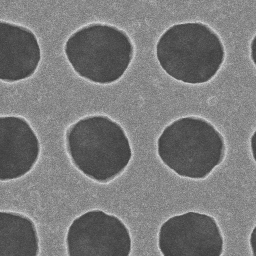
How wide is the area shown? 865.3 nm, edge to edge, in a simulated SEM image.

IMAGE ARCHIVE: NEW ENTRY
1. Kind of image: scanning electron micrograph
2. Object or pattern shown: holes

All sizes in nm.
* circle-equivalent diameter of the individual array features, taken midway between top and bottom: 212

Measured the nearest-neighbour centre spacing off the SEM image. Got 310 nm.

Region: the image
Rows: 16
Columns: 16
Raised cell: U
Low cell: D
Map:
UUUUUUUUUUUUUUUU
DUUUUUUUUUUUDUUU
DDUUDDDDUUDDDDUU
DDUUDDDDUUDDDDUU
DDUUUDDDUUDDDUUU
UUUUUUUUUUUUUUUU
UUUUUUUUUUUUUUUU
DUUUUDDUUUUDDUUU
DDUUDDDDUUDDDDUU
DDUUDDDDUUDDDDUU
DDUUUDDDUUUDDUUU
UUUUUUUUUUUUUUUU
UUUUUUUUUUUUUUUU
DUUUUDDUUUUDDUUU
DDUUDDDDUUDDDDUU
DDUUDDDDUUDDDDUU